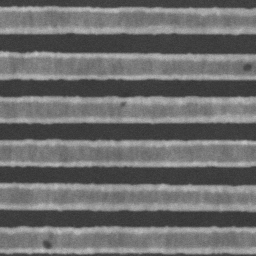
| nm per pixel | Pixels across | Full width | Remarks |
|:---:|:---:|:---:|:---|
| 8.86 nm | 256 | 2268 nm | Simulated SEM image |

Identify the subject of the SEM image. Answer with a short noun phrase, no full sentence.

lines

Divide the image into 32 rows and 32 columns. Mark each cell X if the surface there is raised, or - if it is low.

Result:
--------------------------------
XXXXXXXXXXXXXXXXXXXXXXXXXXXXXXXX
XXXXXXXXXXXXXXXXXXXXXXXXXXXXXXXX
XXXXXXXXXXXXXXXXXXXXXXXXXXXXXXXX
--------------------------------
--------------------------------
--------------------------------
XXXXXXXXXXXXXXXXXXXXXXXXXXXXXXXX
XXXXXXXXXXXXXXXXXXXXXXXXXXXXXXXX
XXXXXXXXXXXXXXXXXXXXXXXXXXXXXXXX
--------------------------------
--------------------------------
XXXXXXXXXXXXXXXXXXXXXXXXXXXXXXXX
XXXXXXXXXXXXXXXXXXXXXXXXXXXXXXXX
XXXXXXXXXXXXXXXXXXXXXXXXXXXXXXXX
--------------------------------
--------------------------------
---X----------------------------
XXXXXXXXXXXXXXXXXXXXXXXXXXXXXXXX
XXXXXXXXXXXXXXXXXXXXXXXXXXXXXXXX
XXXXXXXXXXXXXXXXXXXXXXXXXXXXXXXX
--------------------------------
--------------------------------
XXXXXXXXXXXXXXXXXXXXXXXXXXXXXXXX
XXXXXXXXXXXXXXXXXXXXXXXXXXXXXXXX
XXXXXXXXXXXXXXXXXXXXXXXXXXXXXXXX
--------------------------------
--------------------------------
--XXXXX----XXXXX---XXXXX-XXXXXX-
XXXXXXXXXXXXXXXXXXXXXXXXXXXXXXXX
XXXXXXXXXXXXXXXXXXXXXXXXXXXXXXXX
XXXXXXXXXXXXXXXXXXX-XXXXXXXXXXXX